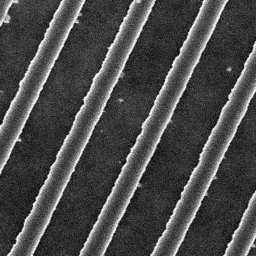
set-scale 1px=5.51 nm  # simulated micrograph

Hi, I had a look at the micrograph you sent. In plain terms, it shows lines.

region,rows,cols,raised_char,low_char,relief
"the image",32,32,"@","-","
@-------@@------@@@------@@@----
@------@@@------@@@------@@@----
@------@@-------@@------@@@-----
------@@@------@@@------@@@-----
------@@-------@@------@@@------
-----@@@------@@@------@@@------
-----@@------@@@------@@@------@
----@@@------@@@------@@@------@
----@@-------@@------@@@------@@
---@@@------@@@------@@@------@@
---@@@------@@------@@@------@@@
--@@@------@@@------@@@------@@@
--@@@------@@------@@@-------@@-
-@@@------@@@------@@@------@@@-
-@@@------@@@------@@-------@@--
@@@------@@@------@@@------@@@--
@@@------@@-------@@-------@@---
@@------@@@------@@@------@@@---
@@------@@-------@@------@@@----
@------@@@------@@@------@@@----
@------@@-------@@-------@@-----
------@@@------@@@------@@@-----
------@@@------@@@------@@@-----
-----@@@------@@@------@@@------
-----@@@------@@@------@@@------
----@@@------@@@------@@@------@
----@@@------@@@------@@@------@
---@@@------@@@------@@@------@@
---@@@------@@@------@@@------@@
--@@@------@@@------@@@------@@@
--@@@------@@@------@@@------@@-
-@@@------@@@------@@@------@@@-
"